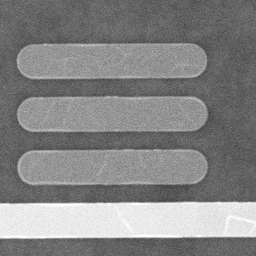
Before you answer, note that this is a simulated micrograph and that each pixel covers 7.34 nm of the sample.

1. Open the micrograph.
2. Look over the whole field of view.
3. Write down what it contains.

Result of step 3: groups of lines, slits or small figures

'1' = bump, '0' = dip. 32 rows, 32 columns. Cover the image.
00000000000000000000000000000000
00000000000000000000000000000000
00000000000000000000000000000000
00000000000000000000000000000000
00000000000000000000000000000000
00000000000000000000000000000000
00011111111111111111111110000000
00111111111111111111111111000000
00111111111111111111111111000000
00011111111111111111111100000000
00000000000000000000000000000000
00000000000000000000000000000000
00011111111111111111111110000000
00111111111111111111111111000000
00111111111111111111111111000000
00011111111111111111111110000000
00000000000000000000000000000000
00000000000000000000000000000000
00000000000000000000000000000000
00011111111111111111111110000000
00111111111111111111111111000000
00111111111111111111111111000000
00011111111111111111111110000000
00000000000000000000000000000000
00000000000000000000000000000000
00000000001111111111111111111111
11111111111111111111111111111111
11111111111111111111111111111111
11111111111111111111111111111111
11111111111111111100011111111111
00000000000000000000000000000000
00000000000000000000000000000000